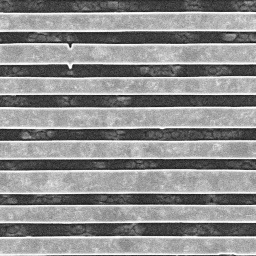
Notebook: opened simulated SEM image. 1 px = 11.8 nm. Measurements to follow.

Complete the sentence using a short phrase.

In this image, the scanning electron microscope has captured parallel lines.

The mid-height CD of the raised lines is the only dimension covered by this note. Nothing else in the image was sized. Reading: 220 nm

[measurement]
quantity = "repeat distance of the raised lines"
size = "378 nm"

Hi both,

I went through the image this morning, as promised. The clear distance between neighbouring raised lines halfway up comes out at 0.157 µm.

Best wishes